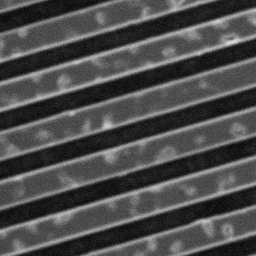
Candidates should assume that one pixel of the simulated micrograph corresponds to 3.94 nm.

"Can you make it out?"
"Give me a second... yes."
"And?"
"parallel lines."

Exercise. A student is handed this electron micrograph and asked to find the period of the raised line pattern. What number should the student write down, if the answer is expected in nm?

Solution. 186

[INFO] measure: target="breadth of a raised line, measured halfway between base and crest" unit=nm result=106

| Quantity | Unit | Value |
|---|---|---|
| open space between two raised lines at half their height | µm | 0.0795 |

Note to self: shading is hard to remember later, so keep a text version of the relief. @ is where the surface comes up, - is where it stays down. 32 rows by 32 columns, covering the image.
@@@@---------@@@@@@@@@@@@-------
---------@@@@@@@@@@@@@---------@
------@@@@@@@@@@@@---------@@@@@
---@@@@@@@@@@@@---------@@@@@@@@
@@@@@@@@@@@---------@@@@@@@@@@@@
@@@@@@@@---------@@@@@@@@@@@@---
@@@@---------@@@@@@@@@@@@-------
@---------@@@@@@@@@@@@---------@
-------@@@@@@@@@@@@---------@@@@
---@@@@@@@@@@@@---------@@@@@@@@
@@@@@@@@@@@@---------@@@@@@@@@@@
@@@@@@@@---------@@@@@@@@@@@@---
@@@@@---------@@@@@@@@@@@@------
@---------@@@@@@@@@@@@----------
-------@@@@@@@@@@@@---------@@@@
----@@@@@@@@@@@@---------@@@@@@@
@@@@@@@@@@@@---------@@@@@@@@@@@
@@@@@@@@@---------@@@@@@@@@@@@--
@@@@@----------@@@@@@@@@@@------
@@---------@@@@@@@@@@@@---------
-------@@@@@@@@@@@@----------@@@
----@@@@@@@@@@@@---------@@@@@@@
-@@@@@@@@@@@@---------@@@@@@@@@@
@@@@@@@@@---------@@@@@@@@@@@@--
@@@@@@---------@@@@@@@@@@@@-----
@@---------@@@@@@@@@@@@@--------
--------@@@@@@@@@@@@---------@@@
----@@@@@@@@@@@@@--------@@@@@@@
-@@@@@@@@@@@@----------@@@@@@@@@
@@@@@@@@@@---------@@@@@@@@@@@@-
@@@@@@@---------@@@@@@@@@@@@----
@@@---------@@@@@@@@@@@@--------